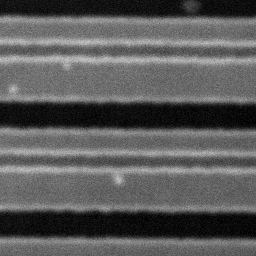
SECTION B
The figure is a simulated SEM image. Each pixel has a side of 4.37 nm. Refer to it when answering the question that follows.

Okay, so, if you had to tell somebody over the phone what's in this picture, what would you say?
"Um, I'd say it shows lines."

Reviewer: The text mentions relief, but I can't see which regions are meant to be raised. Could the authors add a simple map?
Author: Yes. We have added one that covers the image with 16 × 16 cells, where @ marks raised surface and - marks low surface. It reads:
----------------
@@@@@@@@@@@@@@@@
@@@@@@@@@@@@@@@@
@@@@@@@@@@@@@@@@
@@@@@@@@@@@@@@@@
@@@@@@@@@@@@@@@@
----------------
----------------
@@@@@@@@@@@@@@@@
@@@@@@@@@@@@@@@@
@@@@@@@@@@@@@@@@
@@@@@@@@@@@@@@@@
@@@@@@@@@@@@@@@@
----------------
----------------
@@@@@@@@@@@@@@@@